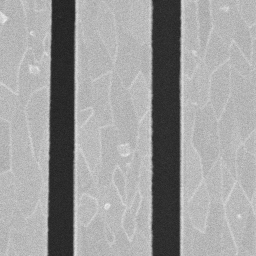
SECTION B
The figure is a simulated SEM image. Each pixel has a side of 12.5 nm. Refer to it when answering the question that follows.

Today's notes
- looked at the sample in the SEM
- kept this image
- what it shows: lines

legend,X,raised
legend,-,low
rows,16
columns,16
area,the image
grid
XXX--XXXX--XXXXX
XXX--XXXX--XXXXX
XXX--XXXX--XXXXX
XXX--XXXX--XXXXX
XXX--XXXX--XXXXX
XXX--XXXX--XXXXX
XXX--XXXX--XXXXX
XXX--XXXX--XXXXX
XXX--XXXX--XXXXX
XXX--XXXX--XXXXX
XXX--XXXX--XXXXX
XXX--XXXX--XXXXX
XXX--XXXX--XXXXX
XXX--XXXX--XXXXX
XXX--XXXX--XXXXX
XXX--XXXX--XXXXX